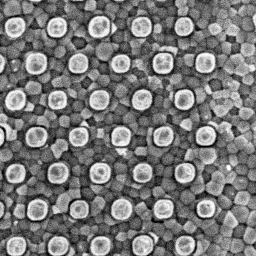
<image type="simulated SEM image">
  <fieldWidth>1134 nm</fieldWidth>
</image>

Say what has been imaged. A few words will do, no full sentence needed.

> a regular array of raised bodies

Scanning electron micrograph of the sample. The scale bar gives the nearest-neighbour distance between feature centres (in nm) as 186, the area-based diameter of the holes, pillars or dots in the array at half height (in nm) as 83.1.